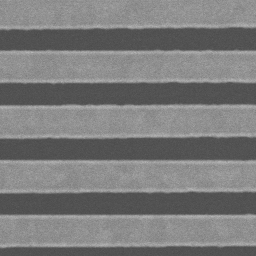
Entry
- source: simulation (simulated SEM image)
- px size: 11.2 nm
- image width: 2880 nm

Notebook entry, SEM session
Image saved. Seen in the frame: lines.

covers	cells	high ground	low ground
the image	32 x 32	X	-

XXXXXXXXXXXXXXXXXXXXXXXXXXXXXXXX
XXXXXXXXXXXXXXXXXXXXXXXXXXXXXXXX
XXXXXXXXXXXXXXXXXXXXXXXXXXXXXXXX
XXXXXXXXXXXX-----X--------------
--------------------------------
--------------------------------
XXXXXXXXXXXXXXXXXXXXXXXXXXXXXXXX
XXXXXXXXXXXXXXXXXXXXXXXXXXXXXXXX
XXXXXXXXXXXXXXXXXXXXXXXXXXXXXXXX
XXXXXXXXXXXXXXXXXXXXXXXXXXXXXXXX
--------------------------------
--------------------------------
--------------------------------
XXXXXXXXXXXXXXXXXXXXXXXXXXXXXXXX
XXXXXXXXXXXXXXXXXXXXXXXXXXXXXXXX
XXXXXXXXXXXXXXXXXXXXXXXXXXXXXXXX
XXXXXXXXXXXXXXXXXXXXXXXXXXXXXXXX
--------------------------------
--------------------------------
--------------------------------
XXXXXXXXXXXXXXXXXXXXXXXXXXXXXXXX
XXXXXXXXXXXXXXXXXXXXXXXXXXXXXXXX
XXXXXXXXXXXXXXXXXXXXXXXXXXXXXXXX
XXXXXXXXXXXXXXXXXXXXXXXXXXXXXXXX
--------------------------------
--------------------------------
--------------------------------
XXXXXXXXXXXXXXXXXXXXXXXXXXXXXXXX
XXXXXXXXXXXXXXXXXXXXXXXXXXXXXXXX
XXXXXXXXXXXXXXXXXXXXXXXXXXXXXXXX
XXXXXXXXXXXXXXXXXXXXXXXXXXXXXXXX
--------------------------------